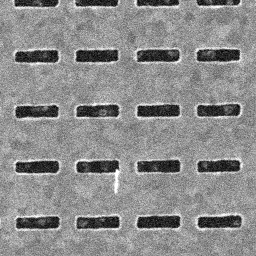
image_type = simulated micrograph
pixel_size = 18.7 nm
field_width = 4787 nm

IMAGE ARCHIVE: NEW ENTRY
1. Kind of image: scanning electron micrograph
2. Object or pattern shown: a regular array of holes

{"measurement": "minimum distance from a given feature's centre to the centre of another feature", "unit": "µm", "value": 1.03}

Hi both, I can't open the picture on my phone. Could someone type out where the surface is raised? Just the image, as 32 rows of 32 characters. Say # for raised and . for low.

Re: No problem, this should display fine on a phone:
##.....##......##.....###.....##
################################
################################
################################
################################
################################
##.....###.....##.....###.....##
##.....##......##.....###.....##
################################
################################
################################
################################
################################
##.....###.....##.....###.....##
##.....###..#..##.....###.....##
################################
################################
################################
################################
################################
##.....###.....##.....###.....##
##.....###....###.....###.....##
################################
################################
################################
################################
################################
##.....###.....##......##.....##
##.....###.....##.....###....###
################################
################################
################################